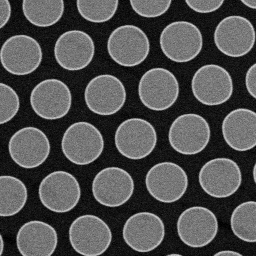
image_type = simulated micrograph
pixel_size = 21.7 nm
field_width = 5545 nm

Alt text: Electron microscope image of an array of small figures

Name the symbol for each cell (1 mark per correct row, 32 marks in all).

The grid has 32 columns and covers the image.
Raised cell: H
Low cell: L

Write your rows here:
HLLHHHHHLLHHHHHLHHHHHLLHHHHHLLLH
HLLHHHHHLLHHHHLLLHHHHLLLLHLLLLLL
HLLLHHHLLLLHHLLLLLLLLLLLLLLLHHHL
LLLLLLLLLLLLLLLHHLLLLHHHHLLHHHHH
LLHLLLLLHHHLLLHHHHLLHHHHHLLHHHHH
HHHHHLLHHHHHLHHHHHHLHHHHHLLHHHHH
HHHHHLLHHHHHLLHHHHHLHHHHHLLLHHHL
HHHHHLLHHHHLLLHHHHLLLLHHLLLLLLLL
LHHHLLLLHHLLLLLLLLLLLLLLLHHHLLLH
LLLLLLLLLLLLHHLLLLHHHHLLHHHHHLLH
LLLLLHHHLLLHHHHLLHHHHHLLHHHHHLLH
HHLLHHHHHLLHHHHHLHHHHHLLHHHHHLLH
HHLLHHHHHLLHHHHHLLHHHHLLLHHHLLLL
HHLLHHHHHLLHHHHLLLLHHLLLLLLLLLLL
HHLLLHHHLLLLLLLLLLLLLLLHHLLLHHHH
LLLLLLLLLHHLLLLHHHHLLLHHHHLLHHHH
LLHHHLLLHHHHLLLHHHHLLHHHHHLLHHHH
LHHHHHLLHHHHHLHHHHHLLHHHHHLLHHHH
LHHHHHLLHHHHHLLHHHHLLLHHHLLLLHHL
LHHHHHLLHHHHLLLLHHLLLLLLLLLLLLLL
LLHHHLLLLLHLLLLLLLLLHHLLLLHHHLLL
LLLLLLLHLLLLHHHHLLLHHHHLLHHHHHLL
HHLLLHHHHHLLHHHHLLHHHHHLLHHHHHLL
HHHLLHHHHHLLHHHHHLHHHHHLLHHHHHLL
HHHLLHHHHHLLHHHHLLLHHHHLLLLHLLLL
HHHLLHHHHLLLLHHLLLLLLLLLLLLLLLHH
HHLLLLLLLLLLLLLLLLLLLLLHHHLLLHHH
LLLLLLLLLHHHHLLLHHHHLLHHHHHLLHHH
LLLHHHLLLHHHHHLHHHHHLLHHHHHLLHHH
LLHHHHHLLHHHHHLHHHHHLLHHHHHLLLHH
LLHHHHHLLHHHHHLLHHHHLLLHHHLLLLLL
LLLHHHHLLLHHHLLLLLLLLLLLLLLHHLLL